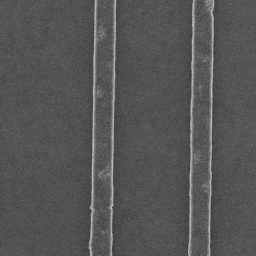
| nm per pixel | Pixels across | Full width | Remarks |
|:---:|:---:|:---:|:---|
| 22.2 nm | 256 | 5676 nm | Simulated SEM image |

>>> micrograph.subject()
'one or a few lines or trenches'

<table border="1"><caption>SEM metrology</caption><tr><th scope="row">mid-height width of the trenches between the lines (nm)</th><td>1720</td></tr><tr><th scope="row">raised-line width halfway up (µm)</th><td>0.455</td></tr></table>